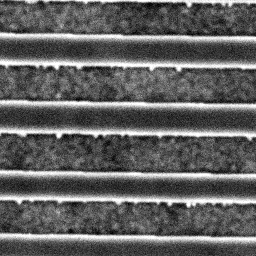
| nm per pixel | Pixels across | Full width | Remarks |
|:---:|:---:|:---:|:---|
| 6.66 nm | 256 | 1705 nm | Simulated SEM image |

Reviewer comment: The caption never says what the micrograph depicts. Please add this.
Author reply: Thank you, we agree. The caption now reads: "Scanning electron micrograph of lines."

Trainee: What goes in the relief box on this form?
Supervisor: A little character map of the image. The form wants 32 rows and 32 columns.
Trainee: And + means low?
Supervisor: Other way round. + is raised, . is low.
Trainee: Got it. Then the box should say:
.......................+........
................................
................................
................................
++++++++++++++++................
++++++++++++++++++++++++++++++++
++++++++++++++++++++++++++++++++
++++++++++++++++++++++++++++++++
................................
................................
................................
................................
................................
++++++++++++++++++++++++++++++++
++++++++++++++++++++++++++++++++
++++++++++++++++++++++++++++++++
.+++++++++++++++++++++++++++++++
................................
................................
................................
................................
++++............................
++++++++++++++++++++++++++++++++
++++++++++++++++++++++++++++++++
++++++++++++++++++++++++++++++++
................................
................................
................................
................................
+++++++++++.....................
++++++++++++++++++++++++++++++++
++++++++++++++++++++++++++++++++